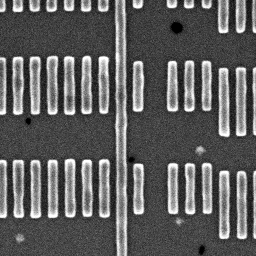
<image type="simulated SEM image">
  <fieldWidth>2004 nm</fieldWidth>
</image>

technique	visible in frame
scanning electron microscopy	wiring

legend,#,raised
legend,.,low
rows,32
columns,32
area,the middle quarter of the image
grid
##...##..##..##...##......##...#
##...##..##..##...##......##..##
##...##..##..##...##......##..##
###..##..##..##...##......##..##
###..##..##..##...##......##..##
###..##..##..##...##......##..##
###..##..##..##...##......##..##
###..##..##..###.###......##..##
###..##..##..###.###......##..##
###..##..##..##...##......##..##
###..##..##..##...##......##..##
###..##..##..##...#.......##...#
.............###................
.............###................
.............###................
.............###................
.............##.................
.............##.................
.............##.................
.............##.................
.............##.................
.............##.................
.............##.................
.............##.................
.##..##..##..###................
.##..##..##..###..##......##...#
.##..##..##..###..##......##...#
.##..##..##..###..##......##...#
.##..##..##..###..##......##...#
.##..##..##..###..##......##...#
.##..##..##..###..##......##...#
.##..##..##..##...##......##...#